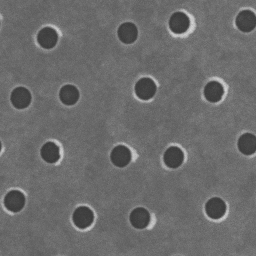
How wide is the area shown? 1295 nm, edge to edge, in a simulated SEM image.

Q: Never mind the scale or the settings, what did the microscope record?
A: a regular array of holes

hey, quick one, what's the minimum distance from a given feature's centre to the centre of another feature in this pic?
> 0.287 micrometres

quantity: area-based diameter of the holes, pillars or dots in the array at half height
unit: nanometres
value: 113